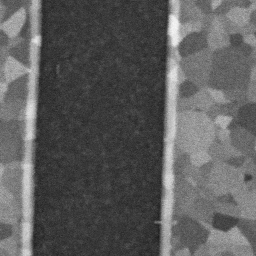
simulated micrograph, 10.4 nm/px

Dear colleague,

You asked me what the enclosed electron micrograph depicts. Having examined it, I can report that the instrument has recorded one or a few lines or trenches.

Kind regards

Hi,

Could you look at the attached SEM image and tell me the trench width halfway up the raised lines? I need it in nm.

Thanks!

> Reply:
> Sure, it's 1470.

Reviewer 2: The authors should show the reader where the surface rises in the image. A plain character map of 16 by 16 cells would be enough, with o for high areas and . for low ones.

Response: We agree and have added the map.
oo.........ooooo
oo.........ooooo
oo.........ooooo
oo.........ooooo
oo.........ooooo
oo.........ooooo
oo.........ooooo
oo.........ooooo
oo.........ooooo
oo.........ooooo
oo.........ooooo
oo.........ooooo
oo.........ooooo
oo........oooooo
oo........oooooo
oo........oooooo